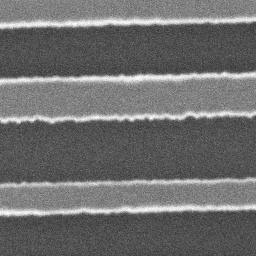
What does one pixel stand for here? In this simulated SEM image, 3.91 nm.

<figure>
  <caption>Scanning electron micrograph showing lines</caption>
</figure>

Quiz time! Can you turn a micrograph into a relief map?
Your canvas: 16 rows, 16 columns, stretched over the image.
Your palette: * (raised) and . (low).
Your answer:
****************
********........
................
................
................
****************
****************
**.***..........
................
................
................
.***************
****************
................
................
................